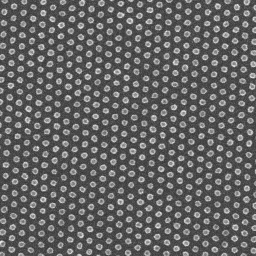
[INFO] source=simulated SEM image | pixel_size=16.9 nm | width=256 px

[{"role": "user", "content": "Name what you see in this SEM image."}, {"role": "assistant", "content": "a regular array of raised bodies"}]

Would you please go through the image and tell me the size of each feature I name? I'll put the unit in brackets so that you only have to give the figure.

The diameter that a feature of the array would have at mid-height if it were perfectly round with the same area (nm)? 89.2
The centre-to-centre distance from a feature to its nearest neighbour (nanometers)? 182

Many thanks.